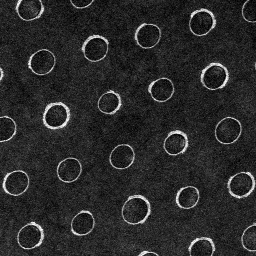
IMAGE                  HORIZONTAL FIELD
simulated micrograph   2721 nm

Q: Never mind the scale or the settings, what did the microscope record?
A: a regular array of holes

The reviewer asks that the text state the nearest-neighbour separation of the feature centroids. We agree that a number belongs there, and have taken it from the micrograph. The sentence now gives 577 nanometres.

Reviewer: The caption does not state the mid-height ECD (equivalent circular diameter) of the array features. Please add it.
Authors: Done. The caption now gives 249 nm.